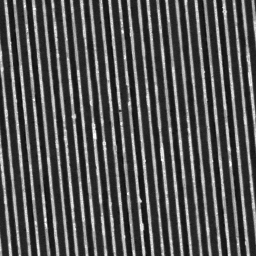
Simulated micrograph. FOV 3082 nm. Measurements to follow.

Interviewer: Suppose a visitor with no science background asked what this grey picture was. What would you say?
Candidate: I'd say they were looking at parallel lines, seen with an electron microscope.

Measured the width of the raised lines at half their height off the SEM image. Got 35.9 nanometers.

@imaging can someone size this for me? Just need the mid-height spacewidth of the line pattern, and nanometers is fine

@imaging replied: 82.3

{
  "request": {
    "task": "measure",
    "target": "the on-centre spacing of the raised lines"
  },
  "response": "114 nm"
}